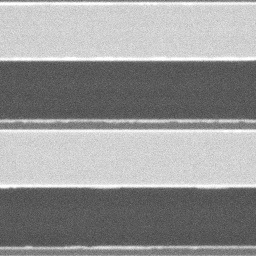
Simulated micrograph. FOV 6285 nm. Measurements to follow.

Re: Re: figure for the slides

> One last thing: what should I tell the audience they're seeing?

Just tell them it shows lines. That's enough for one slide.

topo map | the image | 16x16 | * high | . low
****************
****************
****************
****************
................
................
................
................
****************
****************
****************
****************
................
................
................
.***************